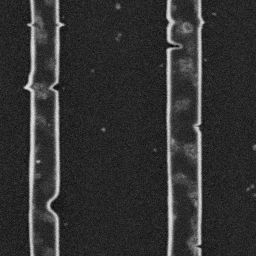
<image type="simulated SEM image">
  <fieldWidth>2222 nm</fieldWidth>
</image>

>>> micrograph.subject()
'one or a few lines or trenches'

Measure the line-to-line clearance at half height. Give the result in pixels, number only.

110